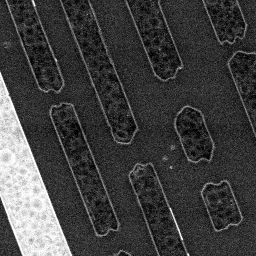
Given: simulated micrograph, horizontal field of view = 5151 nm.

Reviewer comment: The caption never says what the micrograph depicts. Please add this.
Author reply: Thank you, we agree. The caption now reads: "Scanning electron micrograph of one or a few lines or trenches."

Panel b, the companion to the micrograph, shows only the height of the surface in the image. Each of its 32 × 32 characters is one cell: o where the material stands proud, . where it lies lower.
.ooo....ooo.....oooo......oooo..
.ooo....ooo.....oooo......oooo..
..oo.....ooo.....oooo.....ooooo.
..ooo....ooo.....oooo......oooo.
..oooo...oooo.....ooo......ooo..
...ooo....ooo.....oooo..........
...ooo....ooo.....oooo..........
....ooo....ooo.....oooo......ooo
....ooo....ooo.....ooo.......ooo
....oooo...oooo.....oo.......ooo
.....ooo....ooo..............ooo
o...........ooo...............oo
o...........oooo..............oo
oo.....oo....ooo.......o.......o
oo....ooo....oooo.....ooo......o
oo.....ooo....ooo.....oooo.....o
ooo....ooo....ooo.....oooo......
ooo.....ooo...oo.......ooo......
oooo....ooo............oooo.....
oooo....ooo............ooo......
oooo.....ooo....................
ooooo....ooo....ooo.............
ooooo....oooo...oooo............
oooooo....ooo....ooo......ooo...
oooooo....ooo....oooo....oooo...
oooooo.....ooo...oooo.....oo....
.oooooo....ooo....ooo.....oooo..
.oooooo....oooo...oooo.....ooo..
..ooooo.....ooo....ooo.....o....
..oooooo...........oooo.........
..oooooo...........oooo.........
...oooooo......o....ooo.........